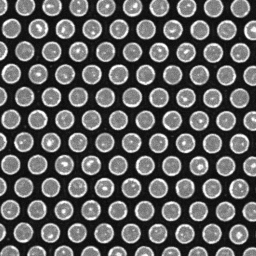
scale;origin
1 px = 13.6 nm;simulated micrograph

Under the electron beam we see a regular array of raised bodies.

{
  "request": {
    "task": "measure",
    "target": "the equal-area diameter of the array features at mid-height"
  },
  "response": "262 nm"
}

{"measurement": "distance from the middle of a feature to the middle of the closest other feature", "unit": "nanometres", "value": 356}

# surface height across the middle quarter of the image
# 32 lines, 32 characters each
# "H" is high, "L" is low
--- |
HLLLLLHHLLLLLHHLLLLLHHLLLLHHLLLL
HHLLLHHHHLLLHHHHLLHHHHLLLHHHHLLL
HHHLLHHHHLLHHHHHLLHHHHHLLHHHHLLL
HHLLLHHHHLLHHHHHLLHHHHHLLHHHHLLL
HHLLLHHHLLLLHHHLLLLHHHLLLLHHHLLL
LLLLLLLLLLLLLLLLLLLLLLLLLLLLLLLL
LLHHHLLLLHHHLLLLHHLLLLHHHLLLLHHH
LHHHHHLLHHHHLLLHHHHLLLHHHHLLHHHH
LHHHHHLLHHHHHLLHHHHLLHHHHHLLHHHH
LLHHHLLLHHHHLLLHHHHLLLHHHHLLHHHH
LLLHLLLLLHHLLLLLHHLLLLLHHLLLLHHH
LLLLLLLLLLLLLLLLLLLLLLLLLLLLLLLL
HHLLLHHHHLLLHHHLLLLHHHLLLHHHHLLL
HHLLHHHHHLLLHHHHLLHHHHLLLHHHHLLL
HHLLLHHHHLLLHHHHLLHHHHLLLHHHHLLL
HHLLLHHHHLLLHHHLLLHHHHLLLHHHHLLL
LLLLLLLLLLLLLLLLLLLLLLLLLLHHLLLL
LLHHHLLLLHHLLLLLHHLLLLLHLLLLLLHL
LLHHHHLLHHHHLLLHHHHLLLHHHHLLHHHH
LHHHHHLLHHHHLLLHHHHLLHHHHHLLHHHH
LHHHHHLLHHHHLLLHHHHLLHHHHHLLHHHH
LLHHHLLLLHHLLLLHHHLLLLHHHLLLLHHH
LLLLLLLLLLLLLLLLLLLLLLLLLLLLLLLL
HHLLLHHHLLLLHHHLLLLHHHLLLLHHLLLL
HHLLLHHHHLLHHHHHLLHHHHLLLHHHHLLL
HHLLLHHHHLLHHHHHLLHHHHHLLHHHHLLH
HHLLLHHHHLLHHHHHLLHHHHLLLHHHHLLL
HLLLLLHHLLLLHHLLLLLHHLLLLLHHLLLL
LLLHLLLLLLLLLLLLLLLLLLLLLLLLLLLL
LLHHHLLLHHHHLLLHHHHLLLHHHLLLLHHH
LHHHHHLLHHHHLLHHHHHLLHHHHHLLHHHH
LHHHHHLLHHHHLLHHHHHLLHHHHHLLHHHH